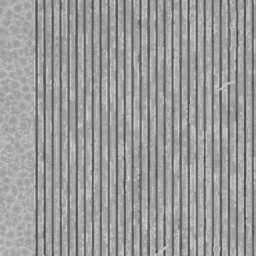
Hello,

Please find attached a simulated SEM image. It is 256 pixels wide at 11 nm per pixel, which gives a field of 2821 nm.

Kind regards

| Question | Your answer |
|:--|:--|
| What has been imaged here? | parallel lines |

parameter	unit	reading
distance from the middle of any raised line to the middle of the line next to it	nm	88.2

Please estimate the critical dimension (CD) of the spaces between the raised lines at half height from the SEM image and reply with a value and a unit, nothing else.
30.3 nanometres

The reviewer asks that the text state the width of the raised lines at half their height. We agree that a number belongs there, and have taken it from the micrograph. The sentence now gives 0.0606 µm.